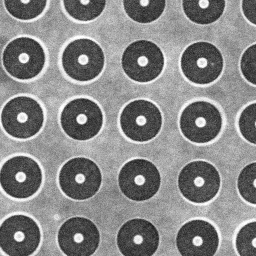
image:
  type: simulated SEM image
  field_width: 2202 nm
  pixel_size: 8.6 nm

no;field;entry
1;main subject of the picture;an array of small figures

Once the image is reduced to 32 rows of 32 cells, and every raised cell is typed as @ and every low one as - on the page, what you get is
@-----@@-----@@------@@-----@@--
@-----@@-----@@@----@@@-----@@--
@@--@@@@@---@@@@@--@@@@@---@@@@-
@@@@@@@@@@@@@@@@@@@@@@@@@@@@@@@@
@@@@@@@@@@@@@@@@@@@@@@@@@@@@@@@@
@----@@@----@@@@---@@@@@---@@@@@
------@@-----@@-----@@@-----@@--
------@------@@------@@-----@@--
@-----@@-----@@-----@@@-----@@--
@----@@@----@@@@----@@@----@@@--
@@@@@@@@@@@@@@@@@@@@@@@@--@@@@@-
@@@@@@@@@@@@@@@@@@@@@@@@@@@@@@@@
@----@@@@---@@@@@--@@@@@--@@@@@@
-----@@@-----@@-----@@@----@@@--
------@------@@-----@@------@@--
-----@@------@@-----@@------@@--
@----@@@----@@@-----@@@-----@@--
@@-@@@@@@@-@@@@@---@@@@----@@@@-
@@@@@@@@@@@@@@@@@@@@@@@@@@@@@@@@
@---@@@@@@@@@@@@@@@@@@@@@@@@@@@@
-----@@@----@@@@---@@@@---@@@@@-
-----@@------@@-----@@@----@@@--
-----@@------@@-----@@------@@--
-----@@-----@@@-----@@------@@--
@---@@@@----@@@@---@@@@----@@@--
@@@@@@@@@@@@@@@@@@@@@@@@@@@@@@@-
@@@@@@@@@@@@@@@@@@@@@@@@@@@@@@@@
----@@@@---@@@@@--@@@@@@--@@@@@@
-----@@-----@@@----@@@@----@@@--
-----@@-----@@@-----@@-----@@---
-----@@-----@@@-----@@-----@@---
----@@@@----@@@----@@@-----@@@--